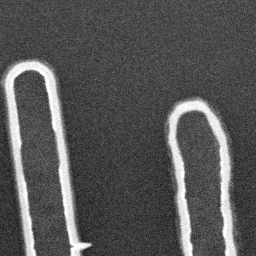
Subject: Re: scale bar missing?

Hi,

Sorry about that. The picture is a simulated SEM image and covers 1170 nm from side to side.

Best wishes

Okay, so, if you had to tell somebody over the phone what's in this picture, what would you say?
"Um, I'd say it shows one or a few lines or trenches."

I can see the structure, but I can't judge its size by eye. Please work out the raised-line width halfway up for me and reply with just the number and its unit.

203 nm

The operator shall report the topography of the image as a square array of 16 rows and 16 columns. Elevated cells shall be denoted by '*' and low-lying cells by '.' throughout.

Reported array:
................
................
................
................
.**.............
.**.............
.**.............
.***.......**...
.***.......***..
.***.......***..
.***.......***..
.***.......***..
.***.......***..
..**.......***..
..***.......**..
..***.......**..